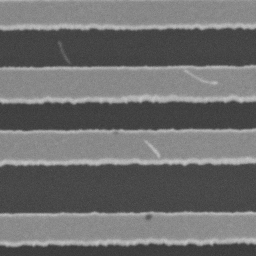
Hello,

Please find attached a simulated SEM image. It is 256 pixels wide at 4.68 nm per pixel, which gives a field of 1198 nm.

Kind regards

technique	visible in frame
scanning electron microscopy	lines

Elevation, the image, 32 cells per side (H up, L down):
HHHHHHHHHHHHHHHHHHHHHHHHHHHHHHHH
HHHHHHHHHHHHHHHHHHHHHHHHHHHHHHHH
HHHHHHHHHHHHHHHHHHHHHHHHHHHHHHHH
HHHHHHHHHHHHHHHHHHHHHLLHLHLHLLLH
LLLLLLLLLLLLLLLLLLLLLLLLLLLLLLLL
LLLLLLLLLLLLLLLLLLLLLLLLLLLLLLLL
LLLLLLLLLLLLLLLLLLLLLLLLLLLLLLLL
LLLLLLLLLLLLLLLLLLLLLLLLLLLLLLLL
HHHHHHHHHHHHHHHHHHHHHHHHHHHHHHHH
HHHHHHHHHHHHHHHHHHHHHHHHHHHHHHHH
HHHHHHHHHHHHHHHHHHHHHHHHHHHHHHHH
HHHHHHHHHHHHHHHHHHHHHHHHHHHHHHHH
HHHHHHHHHHHHHHHHHHHHHHHHHHHHHHHH
LLLLLLLLLLLLLLLLLLLLLLLLLLLLLLLL
LLLLLLLLLLLLLLLLLLLLLLLLLLLLLLLL
LLLLLLLLLLLLLLLLLLLLLLLLLLLLLLLL
HHHHHHHHHHHHHHHHHHHHHHHHHHHHHHHH
HHHHHHHHHHHHHHHHHHHHHHHHHHHHHHHH
HHHHHHHHHHHHHHHHHHHHHHHHHHHHHHHH
HHHHHHHHHHHHHHHHHHHHHHHHHHHHHHHH
HHHHHHHHHHHHHLHHLHHHHHLHLLLLLLLL
LLLLLLLLLLLLLLLLLLLLLLLLLLLLLLLL
LLLLLLLLLLLLLLLLLLLLLLLLLLLLLLLL
LLLLLLLLLLLLLLLLLLLLLLLLLLLLLLLL
LLLLLLLLLLLLLLLLLLLLLLLLLLLLLLLL
LLLLLLLLLLLLLLLLLLLLLLLLLLLLLLLL
LLLLLLLLLLLLLLLLLLLLLLLLLLLLLLLL
HHHHHHHHHHHHHHHHHHHHHHHHHHHHHHHH
HHHHHHHHHHHHHHHHHHHHHHHHHHHHHHHH
HHHHHHHHHHHHHHHHHHHHHHHHHHHHHHHH
HHHHHHHHHHHHHHHHHLLLLHHLHHLLLLLL
LLLLLLLLLLLLLLLLLLLLLLLLLLLLLLLL